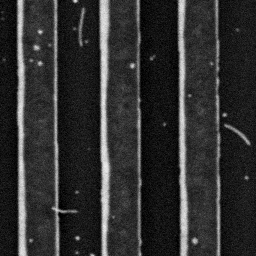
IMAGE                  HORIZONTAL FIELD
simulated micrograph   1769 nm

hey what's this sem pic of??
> lines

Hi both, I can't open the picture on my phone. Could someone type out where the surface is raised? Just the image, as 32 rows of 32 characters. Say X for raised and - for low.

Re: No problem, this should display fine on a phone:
---XXXX------XXXX------XXXX-----
---XXXX------XXXX------XXXX-----
---XXXX------XXXX------XXXX-----
--XXXXX------XXXX------XXXX-----
--XXXXX------XXXX-----XXXXX-----
--XXXXX------XXXX------XXXX-----
---XXXX------XXXX------XXXX-----
---XXXX------XXXX------XXXX-----
---XXXX------XXXX------XXXX-----
---XXXX------XXXX------XXXX-----
---XXXX------XXXX------XXXX-----
---XXXX------XXXX------XXXX-----
---XXXX------XXXX------XXXX-----
---XXXX------XXXX------XXXX-----
---XXXX------XXXX------XXXX-----
---XXXX------XXXX------XXXX-----
---XXXX------XXXX------XXXX-----
---XXXX------XXXX------XXXX-----
---XXXX------XXXX------XXXX-----
---XXXX------XXXX------XXXX-----
---XXXX------XXXX------XXXX-----
---XXXX------XXXX------XXXX-----
---XXXX------XXXXX-----XXXX-----
---XXXX------XXXX------XXXX-----
---XXXX------XXXX------XXXX-----
---XXXX------XXXX------XXXX-----
---XXXX------XXXX------XXXX-----
---XXXX------XXXX------XXXX-----
---XXXX------XXXX------XXXX-----
---XXXX------XXXX------XXXX-----
---XXXX------XXXX------XXXX-----
---XXXX------XXXXX-----XXXX-----